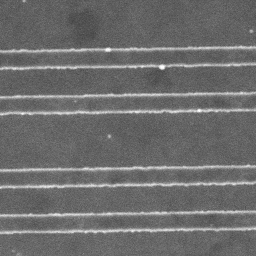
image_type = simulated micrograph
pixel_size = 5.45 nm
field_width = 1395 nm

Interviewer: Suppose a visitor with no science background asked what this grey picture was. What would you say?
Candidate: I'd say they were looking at lines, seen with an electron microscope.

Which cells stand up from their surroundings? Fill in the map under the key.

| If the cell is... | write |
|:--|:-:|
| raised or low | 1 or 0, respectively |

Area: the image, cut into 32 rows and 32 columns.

00000000000000000000000000000000
00000000000000000000000000000000
00000000000000000000000000000000
00000000000000000000000000000000
00000000000000000000000000000000
00000000000000000000000000000000
11111111111111111111111111111111
11111111111111111111111111111111
11111111110100000000100000000000
00000000000000000000000000000000
00000000000000000000000000000000
00000000000000000000000000000000
11111111111111111111111111111111
11111111111111111111111111111111
00000000000000000000000000000000
00000000000000000000000000000000
00000000000000000000000000000000
00000000000000000000000000000000
00000000000000000000000000000000
00000000000000000000000000000000
00000000000000000000000000000000
11111111111111111111111111111111
11111111111111111111111111111111
11000000000000000000000000000000
00000000000000000000000000000000
00000000000000000000000000000000
00000000000000000000000011111111
11111111111111111111111111111111
11111111111111111111111111111111
00000000000000000000000000000000
00000000000000000000000000000000
00000000000000000000000000000000